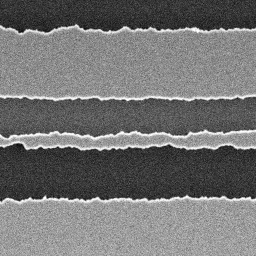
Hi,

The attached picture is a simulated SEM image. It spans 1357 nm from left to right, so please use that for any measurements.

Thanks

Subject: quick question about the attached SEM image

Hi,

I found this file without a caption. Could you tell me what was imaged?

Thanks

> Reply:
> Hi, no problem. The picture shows lines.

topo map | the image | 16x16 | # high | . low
................
................
################
################
################
################
################
################
################
................
................
................
#.##############
################
################
################